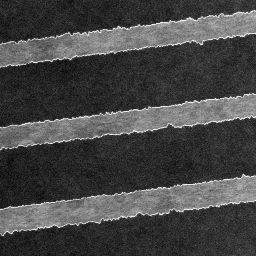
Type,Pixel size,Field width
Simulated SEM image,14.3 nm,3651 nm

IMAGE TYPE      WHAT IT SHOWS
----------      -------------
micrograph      one or a few lines or trenches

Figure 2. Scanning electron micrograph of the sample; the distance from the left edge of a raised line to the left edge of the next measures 1170 nanometres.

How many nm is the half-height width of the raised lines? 332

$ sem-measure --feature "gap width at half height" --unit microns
0.845